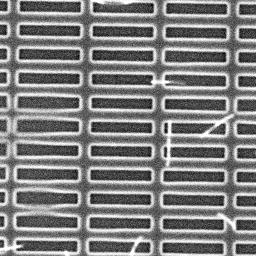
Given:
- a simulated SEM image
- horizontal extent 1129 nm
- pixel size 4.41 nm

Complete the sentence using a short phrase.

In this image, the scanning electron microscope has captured groups of lines, slits or small figures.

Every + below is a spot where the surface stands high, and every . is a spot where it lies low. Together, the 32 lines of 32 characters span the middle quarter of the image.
++++++++++++++++++++++++++++++++
++++++++++++++++++++++++++++++++
....+++...............+++.......
....+++...............+++.......
....+++...............+++.......
+++++++++++...........+++.......
++++++++++++++++++++++++++++++++
++++++++++++++++++++++++++++++++
....+++..............+++++++....
....+++...............+++.......
....+++...............+++.......
..++++++++++++++++....+++.......
++++++++++++++++++++++++++++++++
++++++++++++++++++++++++++++++++
....+++...............+++++..+++
....++................+++.......
....++................+++.......
+++++++++++++++++++++++++++.....
++++++++++++++++++++++++++++++++
++++++++++++++++++++++++++++++++
....+++..............+++++++++++
....++................+++.......
....++................+++.......
++++++++++++++++++...++++.+.....
++++++++++++++++++++++++++++++++
++++++++++++++++++++++++++++++++
....+++..............++++....+++
....++................+++.......
....++................+++.......
+++++++++++++++++++++++++.......
++++++++++++++++++++++++++++++++
++++++++++++++++++++++++++++++++